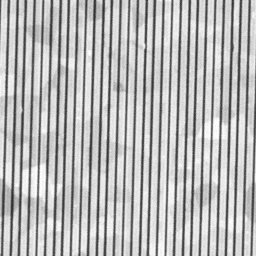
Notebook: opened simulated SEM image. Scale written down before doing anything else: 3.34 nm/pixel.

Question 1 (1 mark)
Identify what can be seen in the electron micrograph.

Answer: parallel lines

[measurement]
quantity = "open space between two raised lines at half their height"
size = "10 nm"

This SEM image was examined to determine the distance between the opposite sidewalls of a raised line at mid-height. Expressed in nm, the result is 16.7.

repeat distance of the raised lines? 28.7 nanometers